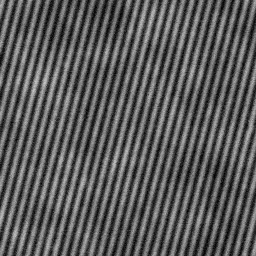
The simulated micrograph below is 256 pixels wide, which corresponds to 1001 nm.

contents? parallel lines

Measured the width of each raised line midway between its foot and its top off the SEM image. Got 16.6 nm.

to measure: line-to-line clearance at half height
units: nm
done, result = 19.9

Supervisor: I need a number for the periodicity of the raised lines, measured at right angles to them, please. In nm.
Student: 34.2